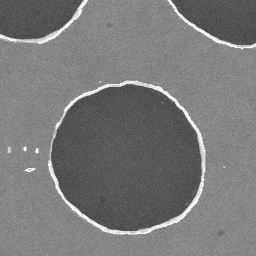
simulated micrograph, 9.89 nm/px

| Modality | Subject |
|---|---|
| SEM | holes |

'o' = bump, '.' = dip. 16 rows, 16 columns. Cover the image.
.....oooooo.....
....oooooooo....
o.oooooooooooo..
oooooooooooooooo
oooooooooooooooo
ooooooo..ooooooo
ooooo......ooooo
oooo........oooo
ooo.........oooo
ooo..........ooo
ooo..........ooo
oooo.........ooo
oooo........oooo
ooooo......ooooo
oooooooooooooooo
oooooooooooooooo